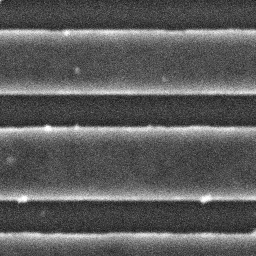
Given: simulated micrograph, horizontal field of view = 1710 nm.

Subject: lines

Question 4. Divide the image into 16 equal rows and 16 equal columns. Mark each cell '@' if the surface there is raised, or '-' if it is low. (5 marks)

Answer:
----------------
----------------
@@@@@@@@@@@@@@@@
@@@@@@@@@@@@@@@@
@@@@@@@@@@@@@@@@
@@@@@@@@@@@@@@@@
----------------
----------------
@@@@@@@@@@@@@@@@
@@@@@@@@@@@@@@@@
@@@@@@@@@@@@@@@@
@@@@@@@@@@@@@@@@
-@----------@@--
----------------
----------------
@@@@@@@@@@@@@@@@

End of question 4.